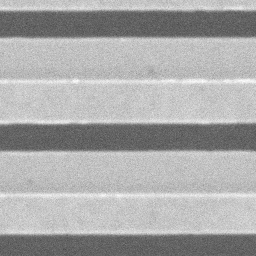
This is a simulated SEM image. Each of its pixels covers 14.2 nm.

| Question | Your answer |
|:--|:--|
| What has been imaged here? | lines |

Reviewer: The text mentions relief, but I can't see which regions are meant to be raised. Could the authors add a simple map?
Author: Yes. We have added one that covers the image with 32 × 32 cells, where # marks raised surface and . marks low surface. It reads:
################################
................................
................................
................................
................................
################################
################################
################################
################################
################################
################################
################################
################################
################################
################################
................................
................................
................................
................................
################################
################################
################################
################################
################################
################################
################################
################################
################################
################################
................................
................................
................................